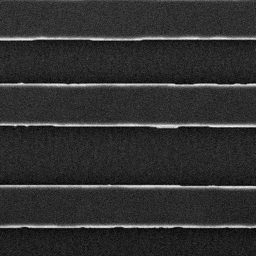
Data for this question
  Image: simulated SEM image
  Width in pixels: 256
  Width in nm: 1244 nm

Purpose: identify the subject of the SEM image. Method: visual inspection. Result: lines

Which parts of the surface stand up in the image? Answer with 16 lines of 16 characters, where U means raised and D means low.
UUUUUUUUUUUUUUUU
UUUUUUUUUUUUUUUU
DDDDDDDDDDDDDDDD
DDDDDDDDDDDDDDDD
DDDDDDDDDDDDDDDD
UUUUUUUUUUUUUUUU
UUUUUUUUUUUUUUUU
UUUUUUUUUUUUUUUU
DDDDDDDDDDDDDDDD
DDDDDDDDDDDDDDDD
DDDDDDDDDDDDDDDD
DDDDDDDDDDDDDDDD
UUUUUUUUUUUUUUUU
UUUUUUUUUUUUUUUU
DDDDDDDDDDDDDDDD
DDDDDDDDDDDDDDDD